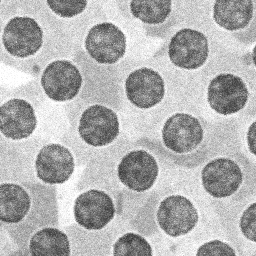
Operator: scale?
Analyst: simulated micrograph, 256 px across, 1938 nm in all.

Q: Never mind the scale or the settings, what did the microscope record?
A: a regular array of holes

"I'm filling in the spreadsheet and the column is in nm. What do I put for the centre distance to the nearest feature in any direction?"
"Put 441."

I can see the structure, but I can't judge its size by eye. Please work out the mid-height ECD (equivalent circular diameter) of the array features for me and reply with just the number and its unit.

306 nanometres